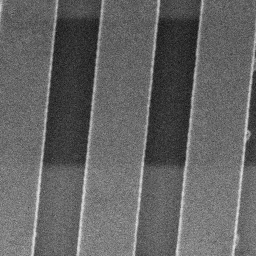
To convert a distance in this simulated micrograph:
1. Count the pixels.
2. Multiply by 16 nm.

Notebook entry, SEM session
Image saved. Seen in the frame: lines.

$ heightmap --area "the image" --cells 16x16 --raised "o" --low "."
oooo..oooo...ooo
ooo...oooo..oooo
ooo...oooo..oooo
ooo...oooo..oooo
ooo...oooo..oooo
ooo...ooo...oooo
ooo...ooo...oooo
ooo...ooo...ooo.
ooo...ooo...ooo.
ooo..oooo...ooo.
ooo..oooo...ooo.
oo...oooo..oooo.
oo...oooo..oooo.
oo...oooo..oooo.
oo...oooo..oooo.
oo...ooo...oooo.